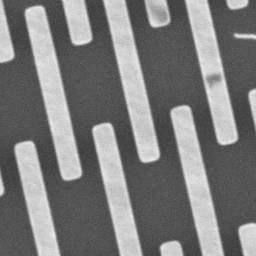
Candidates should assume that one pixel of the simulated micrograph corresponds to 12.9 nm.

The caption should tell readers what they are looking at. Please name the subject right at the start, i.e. groups of lines, slits or small figures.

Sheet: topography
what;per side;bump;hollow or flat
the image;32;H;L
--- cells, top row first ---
LLLLLLLLHHHLLHHHLLHHHLLHHHLLHHHL
HLLHHHLLHHHLLHHHLLHHHLLLHHLLLLLL
HLLHHHLLHHHLLLHHLLLHHLLLHHLLLLLL
HLLLHHLLLHHLLLHHLLLLLLLLHHHLLLLL
HLLLHHLLLHHLLLHHHLLLLLLLHHHLLLLL
HLLLHHHLLHLLLLHHHLLLLLLLHHHLLLLL
HHLLHHHLLLLLLLLHHLLLLLLLLHHLLLLL
HLLLHHHLLLLLLLLHHLLLLLLLLHHHLLLL
LLLLLHHLLLLLLLLHHLLLLLLLLHHHLLLL
LLLLLHHHLLLLLLLHHHLLLLLLLHHHLLLL
LLLLLHHHLLLLLLLHHHLLLLLLLLHHLLLL
LLLLLHHHLLLLLLLLHHLLLLLLLLHHLLLH
LLLLLLHHLLLLLLLLHHLLLLLLLLHHHLLH
LLLLLLHHLLLLLLLLHHHLLLHHLLHHHLLH
LLLLLLHHHLLLLLLLHHHLLHHHLLLHHLLL
LLLLLLHHHLLLLLLLLHHLLLHHLLLHHLLL
LLLLLLLHHLLLHHLLLHHLLLHHLLLHHHLL
LLLLLLLHHLLLHHLLLHHHLLHHHLLHHLLL
LLHHLLLHHHLLHHHLLHHHLLHHHLLLLLLL
LLHHHLLHHHLLHHHLLHHHLLLHHLLLLLLL
LLHHHLLHHHLLHHHLLLLLLLLHHLLLLLLL
LLHHHLLLHHLLLHHLLLLLLLLHHHLLLLLL
LLLHHLLLLLLLLHHHLLLLLLLHHHLLLLLL
LLLHHLLLLLLLLHHHLLLLLLLHHHLLLLLL
LLLHHHLLLLLLLHHHLLLLLLLLHHLLLLLL
LLLHHHLLLLLLLLHHLLLLLLLLHHHLLLLL
LLLLHHLLLLLLLLHHLLLLLLLLHHHLLLLL
LLLLHHHLLLLLLLHHHLLLLLLLHHHLLLLL
LLLLHHHLLLLLLLHHHLLLLLLLLHHLLLHH
LLLLHHHLLLLLLLLHHLLLLLLLLHHLLLHH
LLLLLHHLLLLLLLLHHLLLLHLLLHHHLLHH
LLLLLHHLLLLLLLLHHHLLHHHLLHHHLLHH